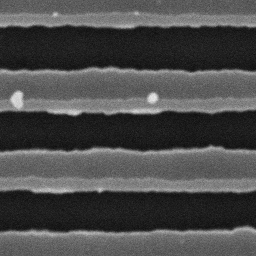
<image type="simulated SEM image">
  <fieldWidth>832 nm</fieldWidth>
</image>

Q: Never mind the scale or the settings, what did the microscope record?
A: lines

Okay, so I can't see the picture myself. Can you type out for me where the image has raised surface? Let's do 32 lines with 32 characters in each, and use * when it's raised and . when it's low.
********************************
********************************
********************************
................................
................................
................................
................................
................................
................................
********************************
********************************
********************************
********************************
********************************
................................
................................
................................
................................
..........................**....
********************************
********************************
********************************
********************************
********************************
................................
................................
................................
................................
................................
********************************
********************************
********************************